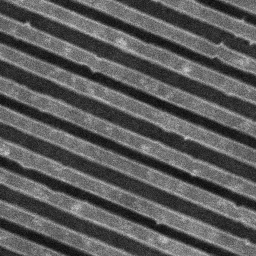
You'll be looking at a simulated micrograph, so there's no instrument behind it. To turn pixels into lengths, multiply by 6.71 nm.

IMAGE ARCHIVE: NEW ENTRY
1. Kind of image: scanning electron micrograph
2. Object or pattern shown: parallel lines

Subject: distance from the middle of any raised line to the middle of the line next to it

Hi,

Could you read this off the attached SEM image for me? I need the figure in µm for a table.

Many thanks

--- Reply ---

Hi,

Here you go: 0.191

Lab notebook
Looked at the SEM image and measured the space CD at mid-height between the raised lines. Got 0.0827 um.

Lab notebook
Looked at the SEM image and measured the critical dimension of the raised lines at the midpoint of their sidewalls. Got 101 nm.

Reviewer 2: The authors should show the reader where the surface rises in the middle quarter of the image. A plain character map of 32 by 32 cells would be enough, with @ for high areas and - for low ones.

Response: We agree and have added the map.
------@@@@@@@@-----------@@@@@@@
-------@@@@@@@@@@----------@@@@@
@@@-------@@@@@@@@@----------@@@
@@@@@-------@@@@@@@@@@---------@
@@@@@@@-------@@@@@@@@@@--------
@@@@@@@@@@-------@@@@@@@@@------
--@@@@@@@@@@-------@@@@@@@@@@---
----@@@@@@@@@@@------@@@@@@@@@@-
-------@@@@@@@@@@-------@@@@@@@@
----------@@@@@@@@@-------@@@@@@
@@----------@@@@@@@@@@-------@@@
@@@------------@@@@@@@@@-------@
@@@@@@-----------@@@@@@@@@@-----
@@@@@@@@-----------@@@@@@@@@@---
--@@@@@@@@@-----------@@@@@@@@@-
----@@@@@@@@@-----------@@@@@@@@
------@@@@@@@@@----------@@@@@@@
@-------@@@@@@@@@@-----------@@@
@@@@-------@@@@@@@@@@---------@@
@@@@@@-------@@@@@@@@@@@--------
@@@@@@@@-------@@@@@@@@@@-------
-@@@@@@@@@@-------@@@@@@@@@-----
---@@@@@@@@@@-------@@@@@@@@@@--
------@@@@@@@@@-------@@@@@@@@@@
--------@@@@@@@@@@-------@@@@@@@
-----------@@@@@@@@@-------@@@@@
@@@----------@@@@@@@@@@-------@@
@@@@@----------@@@@@@@@@@-------
@@@@@@@-----------@@@@@@@@@-----
@@@@@@@@@@-----------@@@@@@@@@--
--@@@@@@@@@@-----------@@@@@@@@@
-----@@@@@@@@@-----------@@@@@@@